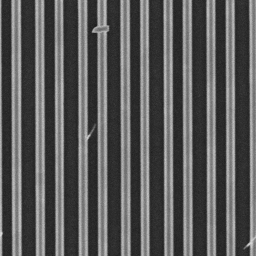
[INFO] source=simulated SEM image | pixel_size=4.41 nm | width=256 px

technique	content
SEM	parallel lines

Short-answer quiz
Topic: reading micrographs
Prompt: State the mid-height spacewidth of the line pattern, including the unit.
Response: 65.1 nm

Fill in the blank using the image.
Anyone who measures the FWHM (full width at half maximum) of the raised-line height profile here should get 27.6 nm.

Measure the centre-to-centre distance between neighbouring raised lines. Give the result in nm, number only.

94.5